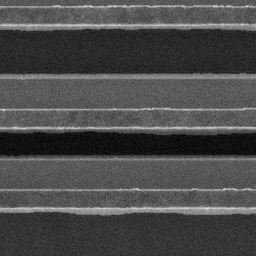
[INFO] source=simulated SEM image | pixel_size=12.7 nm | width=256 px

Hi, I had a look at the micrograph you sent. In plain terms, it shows lines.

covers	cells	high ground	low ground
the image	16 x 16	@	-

@@@@@@@@@@@@@@@@
@@@@@@@@@@@@@@@@
----------------
----------------
----------------
@@@@@@@@@@@@@@@@
@@@@@@@@@@@@@@@@
@@@@@@@@@@@@@@@@
----------------
----------------
@@@@@@@@@@@@@@@@
@@@@@@@@@@@@@@@@
@@@@@@@@@@@@@@@@
----------------
----------------
----------------